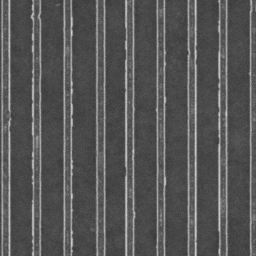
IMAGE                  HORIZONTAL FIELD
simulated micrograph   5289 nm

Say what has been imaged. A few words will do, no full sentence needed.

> parallel lines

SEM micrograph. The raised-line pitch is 642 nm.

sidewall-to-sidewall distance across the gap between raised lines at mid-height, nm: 488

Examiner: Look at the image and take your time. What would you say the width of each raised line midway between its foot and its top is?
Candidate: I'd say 7.25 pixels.